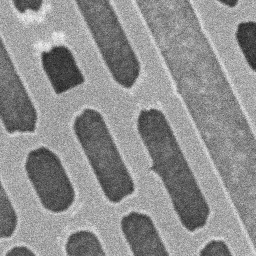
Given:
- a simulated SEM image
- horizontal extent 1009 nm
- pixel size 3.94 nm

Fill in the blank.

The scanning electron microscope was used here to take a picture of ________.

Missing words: parallel lines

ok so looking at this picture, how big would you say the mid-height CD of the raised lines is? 0.0994 um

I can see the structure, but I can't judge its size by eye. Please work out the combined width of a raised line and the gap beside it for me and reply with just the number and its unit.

0.236 um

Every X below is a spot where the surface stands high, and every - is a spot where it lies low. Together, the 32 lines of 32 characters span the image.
XX---XXXX-----XXX-------XXXX--XX
XX-XXXXXXX----XXXX------XXXXXXXX
XXXXXXXXXX-----XXX-------XXXXXXX
XXXXXXXXXXX----XXX-------XXXXX--
XXXXXXXXXXX-----XXX-------XXX---
-XXXXXXXXXXX----XXX-------XXXX--
-XXXXX---XXX-----XXX-------XXX--
-XXXX----XXXX----XXX-------XXXX-
--XXX-----XXX-----XXX-------XXX-
--XXXX----XXXX---XXXX-------XXXX
---XXX----XXXXX--XXXXX-------XXX
---XXXX-XXXXXXXXXXXXXX-------XXX
----XXXXXXXXXXXXXXXXXXX-------XX
----XXXXXXXXXXXXXXXXXXX-------XX
-----XXXXX---XXXX----XXX-------X
-----XXXX----XXXX----XXX-------X
X---XXXXX-----XXX-----XXX-------
XXXXXXXXXX----XXXX----XXX-------
XXXXX-XXXX-----XXX-----XXX------
XXX----XXXX----XXXX----XXX------
XXX-----XXX-----XXX-----XXX-----
XXX-----XXXX----XXX-----XXX-----
XXXX-----XXX-----XXX-----XXX----
-XXX-----XXXX----XXXX----XXX----
-XXXX----XXXX---XXXXX-----XXX---
--XXX----XXXXXXXXXXXXX----XXX---
--XXXX--XXXXXXXX-XXXXX----XXXX--
--XXXXXXXXXXXXX----XXXX---XXXX--
--XXXXXXXXXXXXX-----XXX--XXXXXX-
-XXXXXXXX---XXXX----XXXXXXXXXXX-
XXXXXXXX-----XXX-----XXXXX--XXX-
X---XXXX-----XXXX----XXXX----XXX